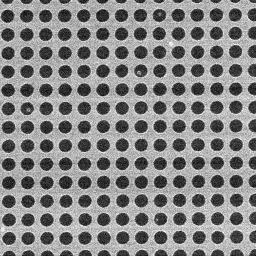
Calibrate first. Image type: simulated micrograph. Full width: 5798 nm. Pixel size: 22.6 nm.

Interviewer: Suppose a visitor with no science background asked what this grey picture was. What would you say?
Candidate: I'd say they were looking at a regular array of holes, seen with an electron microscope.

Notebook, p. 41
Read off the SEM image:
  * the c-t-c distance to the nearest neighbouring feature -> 0.417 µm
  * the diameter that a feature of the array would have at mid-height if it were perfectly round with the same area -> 14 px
